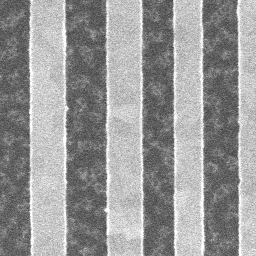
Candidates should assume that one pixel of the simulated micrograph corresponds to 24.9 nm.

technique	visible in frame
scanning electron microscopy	one or a few lines or trenches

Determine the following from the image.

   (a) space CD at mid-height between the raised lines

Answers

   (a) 0.888 microns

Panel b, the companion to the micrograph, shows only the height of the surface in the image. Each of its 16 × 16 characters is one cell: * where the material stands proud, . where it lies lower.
..**...**..**..*
..**...**..**..*
..**...**..**..*
..**...**..**..*
..**...**..**..*
..**...**..**..*
..**...**..**..*
..**...**..**..*
..**...**..**..*
..**...**..**..*
..**...**..**..*
..**...**..**..*
..**...**..**..*
..**...**..**..*
..**...**..**..*
..**...**..**..*